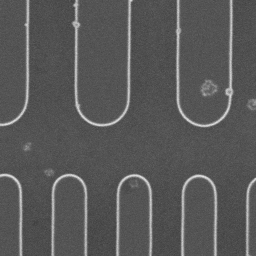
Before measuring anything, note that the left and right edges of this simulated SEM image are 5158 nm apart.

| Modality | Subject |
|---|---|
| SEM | groups of lines, slits or small figures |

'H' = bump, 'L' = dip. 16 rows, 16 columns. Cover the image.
HHLLLHHHLLLHHHLL
HHLLLHHHLLLHHHLL
HHLLLHHHLLLHHHLL
HHLLLHHHLLLHHHLL
HHLLLHHHLLLHHHLL
HHLLLHHHLLLHHHLL
HHLLLHHHLLLHHHLL
HLLLLLHLLLLLHHLL
LLLLLLLLLLLLLLLL
LLLLLLLLLLLLLLLL
LLLLLLLLLLLLLLLL
HLLHHLLLHLLLHLLL
HLLHHLLHHLLHHLLL
HLLHHLLHHLLHHLLL
HLLHHLLHHLLHHLLH
HLLHHLLHHLLHHLLH